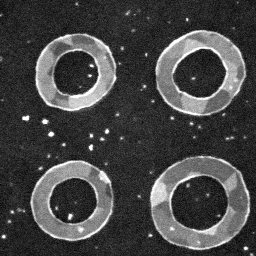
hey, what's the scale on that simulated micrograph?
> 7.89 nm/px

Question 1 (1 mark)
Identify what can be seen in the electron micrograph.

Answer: ring-shaped raised bodies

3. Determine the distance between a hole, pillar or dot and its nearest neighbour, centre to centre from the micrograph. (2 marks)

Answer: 1000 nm